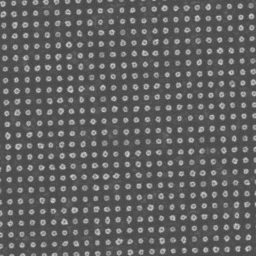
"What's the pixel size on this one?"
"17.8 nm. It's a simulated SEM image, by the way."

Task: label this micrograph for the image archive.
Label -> a regular array of raised bodies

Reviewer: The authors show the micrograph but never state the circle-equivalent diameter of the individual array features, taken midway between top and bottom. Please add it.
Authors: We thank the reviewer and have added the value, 87.7 nm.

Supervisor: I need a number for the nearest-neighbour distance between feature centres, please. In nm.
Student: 189